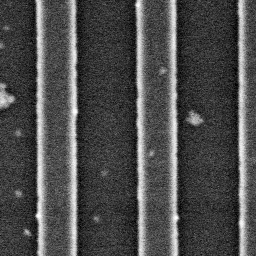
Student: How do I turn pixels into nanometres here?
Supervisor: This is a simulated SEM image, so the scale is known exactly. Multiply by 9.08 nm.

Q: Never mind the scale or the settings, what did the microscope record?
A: lines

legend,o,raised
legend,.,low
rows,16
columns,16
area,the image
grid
..ooo....oo....o
..ooo....oo....o
..ooo....oo....o
..ooo....oo....o
..ooo....oo....o
..ooo....oo....o
..ooo....oo....o
..ooo....oo....o
..ooo....oo....o
..ooo....oo....o
..ooo....oo....o
..ooo....oo....o
..ooo....oo....o
..ooo....oo....o
..ooo....oo....o
..ooo....oo....o